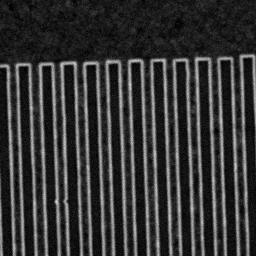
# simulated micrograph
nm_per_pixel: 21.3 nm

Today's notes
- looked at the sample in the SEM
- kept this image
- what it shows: parallel lines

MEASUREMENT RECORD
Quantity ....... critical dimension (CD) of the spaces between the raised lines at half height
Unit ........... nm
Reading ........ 259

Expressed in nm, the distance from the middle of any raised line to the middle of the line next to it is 479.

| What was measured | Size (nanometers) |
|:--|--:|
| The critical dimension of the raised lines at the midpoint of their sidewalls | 221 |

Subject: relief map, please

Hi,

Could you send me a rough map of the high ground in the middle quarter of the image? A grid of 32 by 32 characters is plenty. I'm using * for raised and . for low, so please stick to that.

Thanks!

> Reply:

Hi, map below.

...**...***...**....**...***...*
...**...***...**....**...***...*
...**...***...**....**...***...*
...**...***...**....**...***...*
...**...***...**....**...***...*
...**...***...**....**...***...*
...**....**...***...**...***...*
...***...**...***...**...***...*
...***...**...***...**...***...*
...**....**...***...**....**...*
...**....**...***...**....**...*
...**....**...***...**....**...*
...**....**...***...**....**...*
...***...**...***...**....**...*
...***...**...***...**....**...*
...***...**...***...**....**...*
...***...**...***...**....**...*
...***...**....**...***...**...*
...***...**....**...***...**...*
...***...**....**...***...**...*
...***...**....**...***...**...*
....**...**....**...***...**....
....**...**....**...***...**....
....**...**....**...***...**....
....**...***...**...***...**....
....**...***...**...***...**....
....**...***...**...***...**....
....**...***...**...***...**....
....**...***...**....**...***...
....**...***...**....**...***...
....**...***...**....**...***...
....**...***...**....**...***...